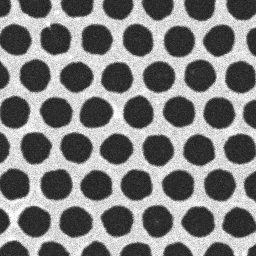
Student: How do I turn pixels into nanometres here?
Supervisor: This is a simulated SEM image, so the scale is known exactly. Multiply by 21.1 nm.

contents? a regular array of holes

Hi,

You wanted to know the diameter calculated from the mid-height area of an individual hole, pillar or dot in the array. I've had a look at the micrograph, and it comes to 686 nanometers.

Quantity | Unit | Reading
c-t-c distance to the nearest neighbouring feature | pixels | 40.5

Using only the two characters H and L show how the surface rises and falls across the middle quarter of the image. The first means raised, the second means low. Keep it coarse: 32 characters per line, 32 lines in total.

LLLLLLHHHHHLLLLLHHHHHLLLLLLHHHHL
LLLLLLLHHHLLLLLLLHHHLLLLLLLLHHLL
LLLLLLLHHHLLLLLLLHHHLLLLLLLLHHLL
LLLLLLLLHLLLLLLLLHHHLLLLLLLLHHLL
LLLLLLLHHLLLLLLLLHHHLLLLLLLLHHLL
LLLLLLHHHHLLLLLLLHHHLLLLLLLHHHHL
HLLLLHHHHHLLLLLLHHHHHLLLLLHHHHHH
HHHHHHHHHHHHHHHHHHHHHHHHHHHHHHHH
HHHHHHLLLLHHHHHHHLLLLHHHHHHLLLHH
LHHHHLLLLLLHHHHHLLLLLLHHHLLLLLLL
LLHHLLLLLLLLHHHLLLLLLLHHHLLLLLLL
LLHHLLLLLLLLHHHLLLLLLLLHHLLLLLLL
LLHHLLLLLLLLHHHLLLLLLLLHHLLLLLLL
LLHHLLLLLLLLHHHLLLLLLLLHHLLLLLLL
LLHHLLLLLLLHHHHLLLLLLLHHHHLLLLLL
LHHHHLLLLLHHHHHHLLLLLHHHHHHLLLLH
HHHHHHHHHHHHHHHHHHHHHHHHHHHHHHHH
HLLLLHHHHHHHLLHHHHHHHHHHHHHHHHHH
LLLLLLHHHHHLLLLLHHHHHLLLLLHHHHHL
LLLLLLLHHHLLLLLLLHHHLLLLLLLHHHLL
LLLLLLLHHLLLLLLLLHHLLLLLLLLHHHLL
LLLLLLLHHLLLLLLLLLHHLLLLLLLLHHLL
LLLLLLLHHLLLLLLLLHHHLLLLLLLLHHLL
LLLLLLLHHHLLLLLLLHHHLLLLLLLHHHLL
HHLLLHHHHHHLLLLLHHHHHLLLLLHHHHHL
HHHHHHHHHHHHHHHHHHHHHHLLLHHHHHHH
HHHHHHHLLHHHHHHHHLLLHHHHHHHHLLHH
LHHHHHLLLLLHHHHLLLLLLHHHHHLLLLLL
LLHHHLLLLLLLHHLLLLLLLLHHHLLLLLLL
LLHHLLLLLLLLHHLLLLLLLLHHLLLLLLLL
LLHHLLLLLLLLHHLLLLLLLLHHLLLLLLLL
LLHHLLLLLLLLHHLLLLLLLLHHLLLLLLLL